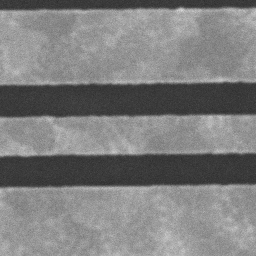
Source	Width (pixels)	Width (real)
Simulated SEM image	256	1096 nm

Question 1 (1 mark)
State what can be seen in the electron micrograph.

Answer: lines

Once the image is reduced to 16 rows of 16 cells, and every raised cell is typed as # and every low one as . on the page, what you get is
................
################
################
################
################
................
................
################
################
################
................
................
################
################
################
################